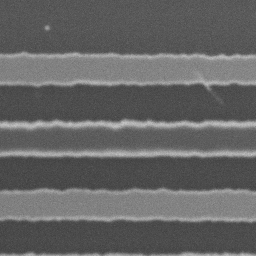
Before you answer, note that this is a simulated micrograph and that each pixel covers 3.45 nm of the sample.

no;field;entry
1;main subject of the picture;lines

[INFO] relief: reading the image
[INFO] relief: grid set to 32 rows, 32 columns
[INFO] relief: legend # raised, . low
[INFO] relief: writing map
................................
................................
................................
................................
................................
................................
................................
################################
################################
################################
#########....#########.#.#.##.##
................................
................................
................................
................................
#.#.#####.####.######.##.#######
################################
################################
################################
.....###.#.########....#.##...##
................................
................................
................................
................................
################################
################################
################################
.............#..........#...####
................................
................................
................................
................................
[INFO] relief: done